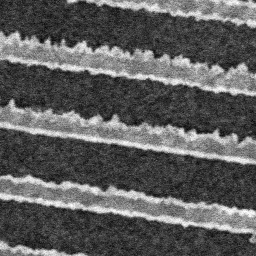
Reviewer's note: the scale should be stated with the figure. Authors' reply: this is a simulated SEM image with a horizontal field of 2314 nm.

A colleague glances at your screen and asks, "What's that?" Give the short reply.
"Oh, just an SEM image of one or a few lines or trenches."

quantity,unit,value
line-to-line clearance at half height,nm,435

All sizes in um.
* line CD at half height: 0.179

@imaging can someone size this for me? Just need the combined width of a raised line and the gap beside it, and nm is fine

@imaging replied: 621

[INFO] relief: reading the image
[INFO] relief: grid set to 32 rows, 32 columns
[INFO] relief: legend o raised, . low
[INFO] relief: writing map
..............ooooooooooooooooo.
.....................ooooooooooo
............................oooo
................................
................................
oooooo..........................
oooooooooooooo..................
..ooooooooooooooooooo.o.........
........oooooooooooooooooo......
................oooooooooooooooo
.......................ooooooooo
.............................ooo
................................
oo..............................
oooooo..........................
ooooooooooooooo.................
....ooooooooooooooooooo.........
............ooooooooooooooooo...
...................ooooooooooooo
..........................oooooo
................................
................................
oo.oo...........................
ooooooooooo.....................
oooooooooooooooooo..............
.......oooooooooooooooo.........
...............oooooooooooooooo.
.....................ooooooooooo
...........................ooooo
................................
................................
oooooo..........................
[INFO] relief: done